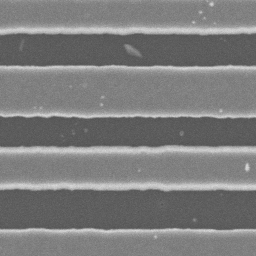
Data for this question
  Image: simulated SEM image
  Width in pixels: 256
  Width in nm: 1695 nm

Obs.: lines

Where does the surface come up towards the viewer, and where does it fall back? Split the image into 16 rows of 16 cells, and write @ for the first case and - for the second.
@@@@@@@@@@@@@@@@
@@@@@@@@@@@@@@@@
----------------
----------------
@@@@@@@@@@@@@@@@
@@@@@@@@@@@@@@@@
@@@@@@@@@@@@@@@@
----------------
----------------
@@@@@@@@@@@@@@@@
@@@@@@@@@@@@@@@@
@@@@@@@@@@@@@@@@
----------------
----------------
@@@@@@@@@@@@@@@@
@@@@@@@@@@@@@@@@